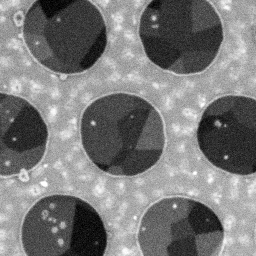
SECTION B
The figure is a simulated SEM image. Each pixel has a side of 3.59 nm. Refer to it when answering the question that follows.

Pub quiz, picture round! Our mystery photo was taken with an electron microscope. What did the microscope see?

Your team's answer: raised bodies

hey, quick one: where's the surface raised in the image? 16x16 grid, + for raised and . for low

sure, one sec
..++++...++++...
.++++++..+++++..
.++++++..+++++..
..++++...+++++..
...++......++...
................
++....+++....+++
+++..+++++..++++
+++..+++++..++++
+++..+++++...+++
++....+++.....++
................
..+++.....++....
..++++...+++++..
.++++++..+++++..
.++++++..+++++..